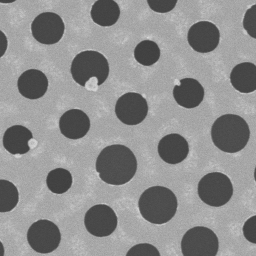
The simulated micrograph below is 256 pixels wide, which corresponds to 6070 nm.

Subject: a regular array of holes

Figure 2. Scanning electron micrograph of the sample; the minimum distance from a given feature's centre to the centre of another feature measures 1370 nm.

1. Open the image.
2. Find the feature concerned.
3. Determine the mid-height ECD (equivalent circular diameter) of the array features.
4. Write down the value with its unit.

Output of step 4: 786 nm